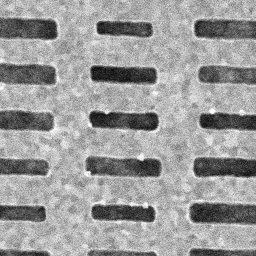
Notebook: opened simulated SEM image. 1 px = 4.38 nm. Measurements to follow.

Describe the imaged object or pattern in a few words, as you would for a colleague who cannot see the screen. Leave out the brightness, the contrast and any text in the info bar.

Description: holes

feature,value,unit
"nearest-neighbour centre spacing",202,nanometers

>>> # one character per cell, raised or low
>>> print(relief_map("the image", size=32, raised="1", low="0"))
11111111111111111111111111111111
11111111111111111111111111111111
00000001111111111111111110000001
00000001111100000001111100000000
00000001111110000001111100000000
11111111111111111111111111111111
11111111111111111111111111111111
11111111111111111111111111111111
00000001111000000001111110000000
00000001111000000000111110000000
10000001111111100001111111000000
11111111111111111111111111111111
11111111111111111111111111111111
11111111111111111111111111111111
00000001111000000000111110000000
00000001111000000000111110000000
11111011111111111111111111111111
11111111111111111111111111111111
11111111111111111111111111111111
11111111111001111111111111111111
00000011111000000000111100000000
00000011111000000000111100000000
11111111111111111111111111111111
11111111111111111111111111111111
11111111111111111111111111111111
11111111111101001111111100000000
00000011111000000001111100000000
00000011111100000001111100000000
11111111111111111111111111111111
11111111111111111111111111111111
11111111111111111111111111111111
00000011111000000001111100000000